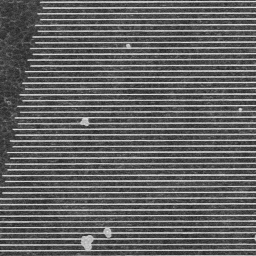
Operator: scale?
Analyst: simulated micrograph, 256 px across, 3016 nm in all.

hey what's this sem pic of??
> parallel lines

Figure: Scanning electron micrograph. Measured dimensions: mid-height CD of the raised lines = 0.0103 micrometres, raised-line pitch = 68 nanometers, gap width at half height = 55.9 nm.